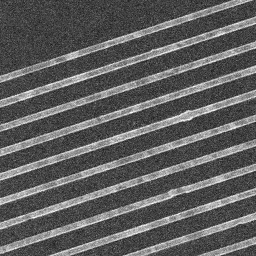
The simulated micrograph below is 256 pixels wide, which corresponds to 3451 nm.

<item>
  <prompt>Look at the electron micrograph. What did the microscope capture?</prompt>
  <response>parallel lines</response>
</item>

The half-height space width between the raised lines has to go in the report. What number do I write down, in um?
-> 0.234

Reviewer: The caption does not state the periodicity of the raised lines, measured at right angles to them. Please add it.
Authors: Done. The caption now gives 0.313 um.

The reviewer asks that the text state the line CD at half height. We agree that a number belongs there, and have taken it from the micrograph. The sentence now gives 78.5 nm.